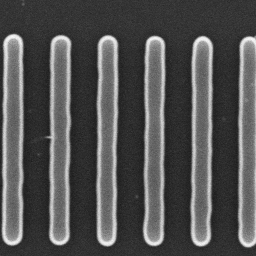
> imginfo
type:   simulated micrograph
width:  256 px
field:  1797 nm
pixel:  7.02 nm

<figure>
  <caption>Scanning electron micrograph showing groups of lines, slits or small figures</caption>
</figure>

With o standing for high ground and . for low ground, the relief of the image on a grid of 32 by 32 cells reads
................................
................................
................................
................................
................................
.oo....oo...oo....oo....oo....oo
.oo....oo...oo....oo....oo....oo
.oo....oo...oo....oo....oo....oo
.oo....oo...oo....oo....oo....oo
.oo....oo....oo...oo....oo....oo
.oo....oo...ooo...oo....oo....oo
.oo....oo...oo....oo....oo....oo
.oo....oo...oo....oo....oo....oo
.oo...ooo...oo....oo....oo....oo
.oo...ooo...oo....oo....oo....oo
.oo....oo...oo....oo....oo....oo
.oo....oo...oo....oo....oo....oo
.oo...ooo...oo....oo....oo....oo
.oo...ooo...oo....oo....oo....oo
.oo...ooo...oo....oo....oo....oo
.oo...oo....oo....oo....oo....oo
.oo...oo....oo....oo....oo....oo
.oo...oo....oo....oo....oo....oo
.oo....o....oo....oo....oo....oo
.oo...oo....oo....oo....oo....oo
.oo...oo....oo....oo....oo....oo
.oo...oo....oo....oo....oo....oo
.oo...oo....oo....oo....oo....oo
ooo...oo....oo....oo....oo....oo
.oo...oo....oo....oo....oo....oo
.............o.....o...........o
................................